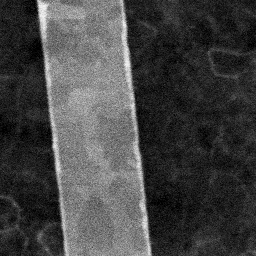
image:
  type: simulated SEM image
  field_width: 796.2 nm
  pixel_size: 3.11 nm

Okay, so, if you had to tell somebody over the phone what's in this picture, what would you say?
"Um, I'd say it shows one or a few lines or trenches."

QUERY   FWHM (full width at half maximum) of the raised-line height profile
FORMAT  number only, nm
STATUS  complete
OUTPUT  259